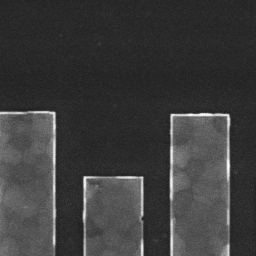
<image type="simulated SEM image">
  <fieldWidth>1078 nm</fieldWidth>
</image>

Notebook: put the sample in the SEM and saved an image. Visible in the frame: one or a few lines or trenches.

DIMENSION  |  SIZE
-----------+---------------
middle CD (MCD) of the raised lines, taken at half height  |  250 nm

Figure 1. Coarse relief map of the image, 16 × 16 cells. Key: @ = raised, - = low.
----------------
----------------
----------------
----------------
----------------
----------------
----------------
@@@--------@@@--
@@@--------@@@--
@@@--------@@@--
@@@--------@@@--
@@@--@@@@--@@@--
@@@--@@@@--@@@--
@@@--@@@@--@@@--
@@@--@@@@--@@@--
@@@--@@@@--@@@--